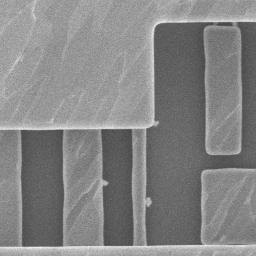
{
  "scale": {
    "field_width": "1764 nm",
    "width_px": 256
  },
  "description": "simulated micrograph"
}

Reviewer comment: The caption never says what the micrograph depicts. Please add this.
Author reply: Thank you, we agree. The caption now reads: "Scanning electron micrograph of wiring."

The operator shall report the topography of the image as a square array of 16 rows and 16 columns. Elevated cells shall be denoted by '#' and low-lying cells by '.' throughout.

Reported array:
################
##########......
##########......
##########......
##########......
##########......
##########......
##########......
................
................
................
................
................
................
................
################